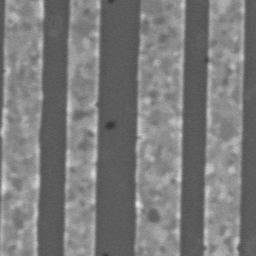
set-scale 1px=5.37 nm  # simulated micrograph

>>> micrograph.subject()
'one or a few lines or trenches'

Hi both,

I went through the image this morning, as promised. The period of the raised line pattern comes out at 364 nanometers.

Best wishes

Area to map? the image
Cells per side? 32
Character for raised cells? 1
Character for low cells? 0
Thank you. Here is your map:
01111000011100000011111000111100
01111000011100000011111000111100
01111000011100000011111000111100
01111000011100000011111000111100
01111000011100000011111000111100
01111000011100000011111000111100
01111000011100000011111000111100
01111000011100000111111000111100
01111000011100000111111000111100
01111000011100000111111000111100
01111000011100000111111000111100
01111000111100000111111000111100
11111000011100000111111000111100
11111000011100000111111000111100
11111000011100000111111000111100
11111000111100000111111000111100
11111000111100000111111000111100
11111000111100000111111000111100
11111000111100000111111000111100
11111000111100000111111000111100
11111000111100000111111000111100
11111000111100000111111000111100
11111000111100000111111000111100
11111000111100000111111000111100
11111000111100000111110000111100
11111000111100000111110000111100
11111000111100000111110000111100
11111000111100000111110000111100
11110000111100000111110000111100
11110000111100000111110000111100
11111000111100000111110000111100
11111000111100000111110000111100